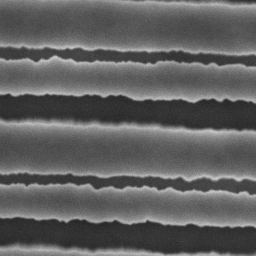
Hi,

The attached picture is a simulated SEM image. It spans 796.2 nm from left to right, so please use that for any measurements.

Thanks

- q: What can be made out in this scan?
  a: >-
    lines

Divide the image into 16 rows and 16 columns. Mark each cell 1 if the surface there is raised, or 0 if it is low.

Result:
1111111111111111
1111111111111111
1111111111111111
1111111111111111
1111111111111111
1111111111111111
0000000000000000
0000000000000000
1111111111111111
1111111111111111
1111111111111111
1111111111111111
1111111111111111
1111111111111111
0000000000000000
1000000000000000